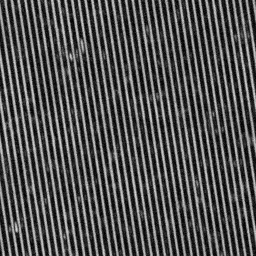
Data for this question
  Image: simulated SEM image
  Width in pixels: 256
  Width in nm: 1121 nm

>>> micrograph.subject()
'parallel lines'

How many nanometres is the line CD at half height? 7.6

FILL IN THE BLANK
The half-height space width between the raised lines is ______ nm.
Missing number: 22.2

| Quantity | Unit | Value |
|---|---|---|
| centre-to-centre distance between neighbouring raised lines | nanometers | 29.1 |